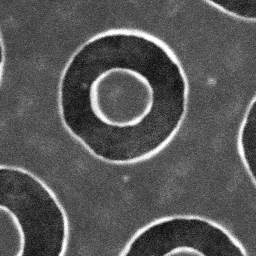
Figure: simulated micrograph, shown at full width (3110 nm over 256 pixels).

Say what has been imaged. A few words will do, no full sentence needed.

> ring-shaped grooves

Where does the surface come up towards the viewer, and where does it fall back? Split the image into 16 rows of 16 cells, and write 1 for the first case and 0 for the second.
1111111111111100
1111111111111111
1111110001111111
1111100000011111
1111000100011111
1111001110001111
1111001110001111
1111001110011110
1111100000011110
1111110000111110
1111111111111111
0001111111111111
0001111111111111
1000111111111111
1000111110000011
1000111100000001